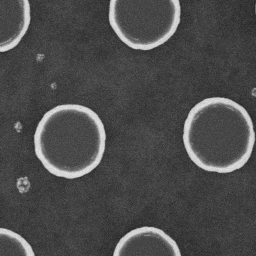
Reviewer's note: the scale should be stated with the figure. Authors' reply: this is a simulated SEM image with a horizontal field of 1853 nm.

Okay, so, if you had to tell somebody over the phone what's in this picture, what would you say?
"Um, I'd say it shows raised bodies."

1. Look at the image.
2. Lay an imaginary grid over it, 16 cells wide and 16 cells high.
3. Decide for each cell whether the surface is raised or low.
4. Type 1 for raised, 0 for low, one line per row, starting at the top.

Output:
1100000111100000
1100000111100000
1000000011000000
0000000000000000
0000000000000000
0000000000000000
0000000000000110
0001110000001111
0011110000001111
0011110000001111
0001110000000100
0000000000000000
0000000000000000
0000000000000000
0000000011000000
1100000111100000